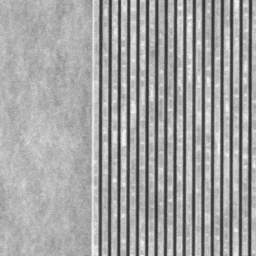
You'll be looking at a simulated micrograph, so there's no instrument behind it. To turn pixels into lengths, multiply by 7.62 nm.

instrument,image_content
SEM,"parallel lines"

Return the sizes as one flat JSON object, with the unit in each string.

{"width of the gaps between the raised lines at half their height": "25.7 nm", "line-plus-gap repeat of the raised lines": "71.2 nm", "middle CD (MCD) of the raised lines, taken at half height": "45.7 nm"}